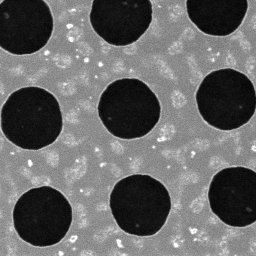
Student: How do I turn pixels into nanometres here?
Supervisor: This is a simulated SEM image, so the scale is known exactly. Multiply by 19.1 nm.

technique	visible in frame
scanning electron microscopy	holes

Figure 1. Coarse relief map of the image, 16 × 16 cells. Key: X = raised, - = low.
---XXX---XXX---X
---XXX---XXX---X
---XXXX--XXXXXXX
XXXXXXXXXXXXXXXX
XXXXXXXXXXXXX--X
X-XXXXX--XXX----
----XX----XX----
----XX----XXX---
----XXX--XXXXXXX
XXXXXXXXXXXXXXXX
XXXXXXXXXXXXXX-X
XXXXXXX---XXX---
X---XXX----XX---
X----XX----XXX--
X---XXXX--XXXXXX
XXXXXXXXXXXXXXXX